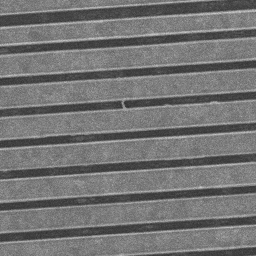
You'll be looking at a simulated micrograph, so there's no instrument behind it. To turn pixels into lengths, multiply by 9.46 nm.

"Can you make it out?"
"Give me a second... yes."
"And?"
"parallel lines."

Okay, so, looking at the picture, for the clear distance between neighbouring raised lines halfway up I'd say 95.6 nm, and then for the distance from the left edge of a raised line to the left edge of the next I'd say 0.292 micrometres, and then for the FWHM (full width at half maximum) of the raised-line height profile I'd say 0.2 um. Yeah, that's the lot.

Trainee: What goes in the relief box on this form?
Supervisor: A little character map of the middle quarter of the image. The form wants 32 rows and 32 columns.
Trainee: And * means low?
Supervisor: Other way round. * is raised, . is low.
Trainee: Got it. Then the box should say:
***********************.........
*********.......................
................................
...................*************
.....***************************
********************************
********************************
********************************
********************............
******..........................
.........................*******
.............*******************
********************************
********************************
********************************
********************************
**************..................
................................
.........................*******
..........**********************
********************************
********************************
********************************
*****************************...
************....................
................................
......................**********
........************************
********************************
********************************
********************************
***************************.....